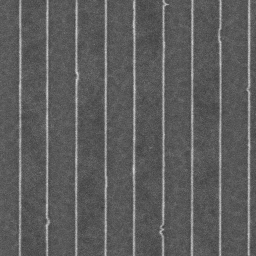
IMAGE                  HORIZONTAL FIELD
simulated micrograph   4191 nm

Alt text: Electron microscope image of parallel lines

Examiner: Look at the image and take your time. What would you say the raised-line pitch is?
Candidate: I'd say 0.943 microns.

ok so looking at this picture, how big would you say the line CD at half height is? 0.471 microns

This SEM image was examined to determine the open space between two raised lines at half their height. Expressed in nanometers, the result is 471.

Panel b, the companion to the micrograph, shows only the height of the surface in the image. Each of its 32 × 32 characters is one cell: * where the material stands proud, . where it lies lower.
...***....***....****...****...*
...***....***....***....****...*
...***....***....***....****...*
...***....***....***....****...*
...***....***....***....***....*
...***....***....***....****...*
...***....***....***....****...*
...***....***....***....****...*
...***....***....***....****...*
...***....***....***....****...*
...***....***....***....****...*
...***....***....***....****...*
...***....***....***....****...*
...***....***....***....****...*
...***....***....***....****...*
...***....***....***....****...*
...***....***....***....****...*
...***....***....***....****...*
...***....***....***....****...*
..****....***....***....****...*
...***....***....***....****...*
...***....***....***....****...*
..****....***....***....****...*
..****....***....***....****...*
...***....***....***....****...*
...***....***....***....****...*
..****....***....***....****...*
...***....***....***....****...*
..****....***....***....****...*
..****....***....***....***....*
..****....***....***....***....*
..****....***....***....***....*